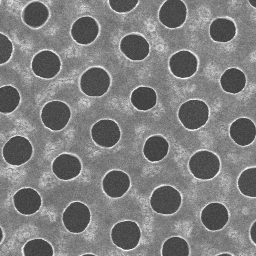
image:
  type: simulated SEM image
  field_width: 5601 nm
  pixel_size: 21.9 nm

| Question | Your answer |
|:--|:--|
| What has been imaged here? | a regular array of holes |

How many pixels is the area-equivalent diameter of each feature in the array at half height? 27.6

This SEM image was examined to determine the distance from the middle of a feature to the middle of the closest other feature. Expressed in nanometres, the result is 1120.